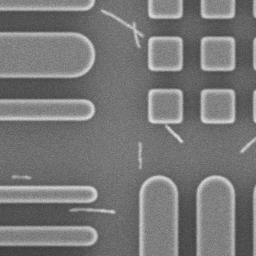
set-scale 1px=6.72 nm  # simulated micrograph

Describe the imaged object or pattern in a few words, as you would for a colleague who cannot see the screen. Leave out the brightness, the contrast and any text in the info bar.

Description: groups of lines, slits or small figures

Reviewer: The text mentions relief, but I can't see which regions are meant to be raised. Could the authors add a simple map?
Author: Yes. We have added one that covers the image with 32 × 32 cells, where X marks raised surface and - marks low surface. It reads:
XXXXXXXXXXXX-------XXXX--XXXX---
-------------------XXXX--XXXX---
--------------------------------
--------------------------------
XXXXXXXXXX----------------------
XXXXXXXXXXX--------XXXX--XXXX---
XXXXXXXXXXXX-------XXXX--XXXX---
XXXXXXXXXXXX-------XXXX--XXXX---
XXXXXXXXXXX--------XXXX--XXXX---
XXXXXXXXXX----------------------
--------------------------------
-------------------XXXX--XXXX---
-------------------XXXX--XXXX---
XXXXXXXXXXXX-------XXXX--XXXX---
XXXXXXXXXXX--------XXXX--XXXX---
--------------------------------
--------------------------------
--------------------------------
--------------------------------
--------------------------------
--------------------------------
--------------------------------
-------------------XX-----XX----
XXXXXXXXXXXX------XXXX---XXXX---
XXXXXXXXXXXX------XXXX---XXXX---
------------------XXXX---XXXX---
------------------XXXX---XXXX---
------------------XXXX---XXXX---
XXXXXXXXXXX-------XXXX---XXXX---
XXXXXXXXXXXX------XXXX---XXXX---
XXXXXXXXXXXX------XXXX---XXXX---
------------------XXXX---XXXX---